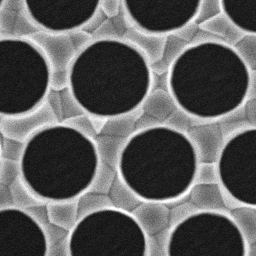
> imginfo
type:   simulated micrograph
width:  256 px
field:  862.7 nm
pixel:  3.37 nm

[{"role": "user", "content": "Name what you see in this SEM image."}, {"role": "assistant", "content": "holes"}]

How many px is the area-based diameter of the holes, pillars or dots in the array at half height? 74.2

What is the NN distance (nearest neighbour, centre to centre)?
330 nanometres